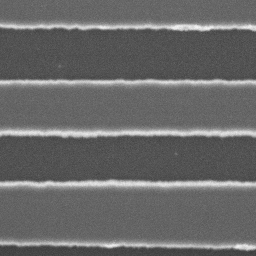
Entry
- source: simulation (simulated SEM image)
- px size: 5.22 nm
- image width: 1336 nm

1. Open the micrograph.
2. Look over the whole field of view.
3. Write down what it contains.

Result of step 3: lines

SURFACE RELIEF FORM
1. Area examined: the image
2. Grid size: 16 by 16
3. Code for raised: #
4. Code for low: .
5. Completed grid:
################
################
................
................
................
################
################
################
................
................
................
.#...###.....##.
################
################
################
...............#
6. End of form